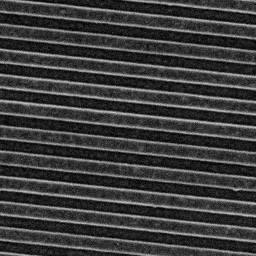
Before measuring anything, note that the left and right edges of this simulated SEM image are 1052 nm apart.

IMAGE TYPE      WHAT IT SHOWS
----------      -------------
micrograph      parallel lines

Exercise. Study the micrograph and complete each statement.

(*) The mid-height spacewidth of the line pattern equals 11.8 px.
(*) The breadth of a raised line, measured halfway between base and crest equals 55.6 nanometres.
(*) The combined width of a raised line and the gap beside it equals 104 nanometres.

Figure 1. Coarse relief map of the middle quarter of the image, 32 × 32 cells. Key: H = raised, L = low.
HHHHHHHHHHHHHHHHHHHHHHHLLLLLLLLL
LLHHHHHHHHHHHHHHHHHHHHHHHHHHHHHH
LLLLLLLLLLLLHHHHHHHHHHHHHHHHHHHH
LLLLLLLLLLLLLLLLLLLLLHHHHHHHHHHH
HLLLLLLLLLLLLLLLLLLLLLLLLLLLLLHH
HHHHHHHHHHLLLLLLLLLLLLLLLLLLLLLL
HHHHHHHHHHHHHHHHHHHHLLLLLLLLLLLL
HHHHHHHHHHHHHHHHHHHHHHHHHHHHHLLL
LLLLLLLLHHHHHHHHHHHHHHHHHHHHHHHH
LLLLLLLLLLLLLLLLLHHHHHHHHHHHHHHH
LLLLLLLLLLLLLLLLLLLLLLLLLLLHHHHH
HHHHHHLLLLLLLLLLLLLLLLLLLLLLLLLL
HHHHHHHHHHHHHHHHLLLLLLLLLLLLLLLL
HHHHHHHHHHHHHHHHHHHHHHHHHLLLLLLL
LLLLHHHHHHHHHHHHHHHHHHHHHHHHHHHH
LLLLLLLLLLLLLLHHHHHHHHHHHHHHHHHH
LLLLLLLLLLLLLLLLLLLLLLLHHHHHHHHH
HHHLLLLLLLLLLLLLLLLLLLLLLLLLLLLL
HHHHHHHHHHHHLLLLLLLLLLLLLLLLLLLL
HHHHHHHHHHHHHHHHHHHHHHLLLLLLLLLL
LLHHHHHHHHHHHHHHHHHHHHHHHHHHHHHL
LLLLLLLLLLHHHHHHHHHHHHHHHHHHHHHH
LLLLLLLLLLLLLLLLLLLHHHHHHHHHHHHH
HLLLLLLLLLLLLLLLLLLLLLLLLLLLLLLH
HHHHHHHHHHLLLLLLLLLLLLLLLLLLLLLL
HHHHHHHHHHHHHHHHHHHHLLLLLLLLLLLL
HHHHHHHHHHHHHHHHHHHHHHHHHHHHHLLL
LLLLLLLLHHHHHHHHHHHHHHHHHHHHHHHH
LLLLLLLLLLLLLLLLLLHHHHHHHHHHHHHH
LLLLLLLLLLLLLLLLLLLLLLLLLLLHHHHH
HHHHHHHLLLLLLLLLLLLLLLLLLLLLLLLL
HHHHHHHHHHHHHHHHLLLLLLLLLLLLLLLL